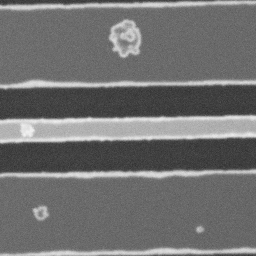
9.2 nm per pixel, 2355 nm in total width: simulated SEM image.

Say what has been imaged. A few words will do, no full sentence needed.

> lines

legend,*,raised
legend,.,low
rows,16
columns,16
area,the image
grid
****************
****************
****************
****************
****************
................
................
..*.************
****************
................
................
****************
****************
****************
****************
****************